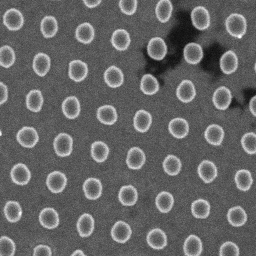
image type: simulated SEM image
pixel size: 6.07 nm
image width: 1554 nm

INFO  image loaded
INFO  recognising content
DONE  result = a regular array of raised bodies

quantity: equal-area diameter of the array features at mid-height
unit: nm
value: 121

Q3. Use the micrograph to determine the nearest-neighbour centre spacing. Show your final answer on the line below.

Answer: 221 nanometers